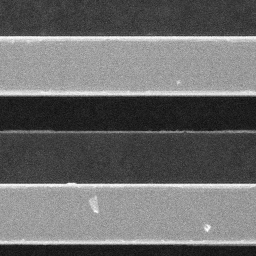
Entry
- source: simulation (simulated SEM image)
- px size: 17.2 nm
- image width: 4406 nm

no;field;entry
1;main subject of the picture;lines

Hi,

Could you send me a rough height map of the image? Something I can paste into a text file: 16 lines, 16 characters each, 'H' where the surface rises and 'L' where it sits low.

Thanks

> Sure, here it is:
HHHHHHHHHHHHHHHH
HHHHHHHHHHHHHHHH
HHHHHHHHHHHHHHHH
HHHHHHHHHHHHHHHH
HHHHHHHHHHHHHHHH
HHHHHHHHHHHHHHHH
LLLLLLLLLLLLLLLL
LLLLLLLLLLLLLLLL
HHHHHHHHHHHHHHHH
HHHHHHHHHHHHHHHH
HHHHHHHHHHHHHHHH
HHHHHHHHHHHHHHHH
HHHHHHHHHHHHHHHH
HHHHHHHHHHHHHHHH
HHHHHHHHHHHHHHHH
LLLLLLLLLLLLLLLL